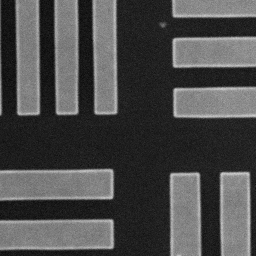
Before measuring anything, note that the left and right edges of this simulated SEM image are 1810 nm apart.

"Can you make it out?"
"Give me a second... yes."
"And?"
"groups of lines, slits or small figures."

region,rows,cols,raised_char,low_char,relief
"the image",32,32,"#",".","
..###..###..##........##########
..###..###..##........##########
..###..###..##..................
..###..###..##..................
..###..###..##..................
..###..###..##........##########
..###..###..##........##########
..###..###..##........##########
..###..###..##..................
..###..###..##..................
..###..###..##..................
..###..###..###.......##########
..###..###..###.......##########
..###..###..###.......##########
......................##########
................................
................................
................................
................................
................................
................................
##############..................
##############.......####...###.
##############.......####...###.
##############.......####...###.
.....................####...###.
.....................####...###.
............##.......####...###.
##############.......####...###.
##############.......####...###.
##############.......####...###.
.....................####...###.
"